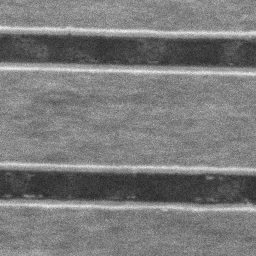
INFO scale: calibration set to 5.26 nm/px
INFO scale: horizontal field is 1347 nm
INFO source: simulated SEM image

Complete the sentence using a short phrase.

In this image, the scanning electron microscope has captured one or a few lines or trenches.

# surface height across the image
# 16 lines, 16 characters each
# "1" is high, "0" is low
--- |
1111111111111111
1111111111111111
0000000000000000
0000000000000000
1111111111111111
1111111111111111
1111111111111111
1111111111111111
1111111111111111
1111111111111111
0000111111111111
0000000000000000
0000000000000000
1111111111111111
1111111111111111
1111111111111111